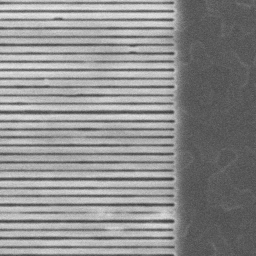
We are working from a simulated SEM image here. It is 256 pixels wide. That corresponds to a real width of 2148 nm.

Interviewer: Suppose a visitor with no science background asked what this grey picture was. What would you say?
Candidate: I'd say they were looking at parallel lines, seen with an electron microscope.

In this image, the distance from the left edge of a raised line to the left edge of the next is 70.8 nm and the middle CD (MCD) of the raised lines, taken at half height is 5.38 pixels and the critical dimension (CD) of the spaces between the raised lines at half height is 22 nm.